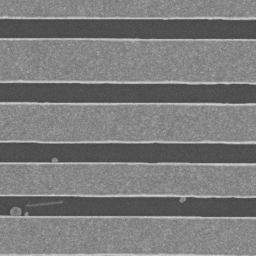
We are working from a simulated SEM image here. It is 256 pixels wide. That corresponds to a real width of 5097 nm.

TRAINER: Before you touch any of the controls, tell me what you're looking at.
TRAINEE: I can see lines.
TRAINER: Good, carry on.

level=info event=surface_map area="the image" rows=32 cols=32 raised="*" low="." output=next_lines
********************************
********************************
................................
................................
................................
********************************
********************************
********************************
********************************
********************************
............................*..*
................................
................................
********************************
********************************
********************************
********************************
********************************
................................
................................
********************************
********************************
********************************
********************************
..........**********************
................................
................................
********************************
********************************
********************************
********************************
********************************